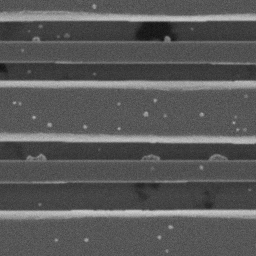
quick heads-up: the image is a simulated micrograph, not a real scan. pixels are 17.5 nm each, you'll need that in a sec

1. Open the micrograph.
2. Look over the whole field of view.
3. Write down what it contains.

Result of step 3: lines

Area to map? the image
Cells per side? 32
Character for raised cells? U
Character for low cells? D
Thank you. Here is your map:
UUUUUUUUUUUUUUUUUUUUUUUUUUUUUUUU
UUUUUUUUUUUUUUUUUUUUUUUUUUUUUUUU
DDDDDDDDDDDDDDDDDDDDDDDDDDDDDDDD
DDDDDDDDDDDDDDDDDDDDDDDDDDDDDDDD
DDDDDDDDDDDDDDDDDDDDDDDDDDDDDDDD
UUUUUUUUUUUUUUUUUUUUUUUUUUUUUUUU
UUUUUUUUUUUUUUUUUUUUUUUUUUUUUUUU
UUUUUUUUUUUUUUUUUUUUUUUUUUUUUUUU
DDDDDDDDDDDDDDDDDDDDDDDDDDDDDDDD
DDDDDDDDDDDDDDDDDDDDDDDDDDDDDDDD
UUUUUUUUUUUUUUUUUDDDDDDDDDDDDDDD
UUUUUUUUUUUUUUUUUUUUUUUUUUUUUUUU
UUUUUUUUUUUUUUUUUUUUUUUUUUUUUUUU
UUUUUUUUUUUUUUUUUUUUUUUUUUUUUUUU
UUUUUUUUUUUUUUUUUUUUUUUUUUUUUUUU
UUUUUUUUUUUUUUUUUUUUUUUUUUUUUUUU
UUUUUUUUUUUUUUUUUUUUUUUUUUUUUUUU
DDDDDDDDDDDDDDDDDDDDDDDDDDDDUUUU
DDDDDDDDDDDDDDDDDDDDDDDDDDDDDDDD
DDDDDDDDDDDDDDDDDDDDDDDDDDDDDDDD
UUUUUUUUUUUUUUUUUUUUUUUUUUUUUUUU
UUUUUUUUUUUUUUUUUUUUUUUUUUUUUUUU
UUUUUUUUUUUUUUUUUUUUUUUUUUUUUUUU
DDDDDDDDDDDDDDDDDDDDDDDDDDDDDDDD
DDDDDDDDDDDDDDDDDDDDDDDDDDDDDDDD
DDDDDDDDDDDDDDDDDDDDDDDDDDDDDDDD
DDDDDDDDDDDDDDDDDDDDDDDDDDDDDDDD
UUUUUUUUUUUUUUUUUUUUUUUUUUUUUUUU
UUUUUUUUUUUUUUUUUUUUUUUUUUUUUUUU
UUUUUUUUUUUUUUUUUUUUUUUUUUUUUUUU
UUUUUUUUUUUUUUUUUUUUUUUUUUUUUUUU
UUUUUUUUUUUUUUUUUUUUUUUUUUUUUUUU